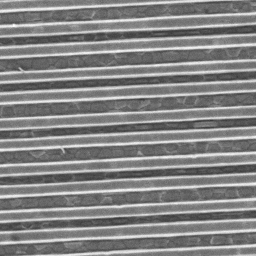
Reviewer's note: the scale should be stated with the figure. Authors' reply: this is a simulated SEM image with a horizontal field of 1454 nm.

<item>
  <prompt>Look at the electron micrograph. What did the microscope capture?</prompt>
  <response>parallel lines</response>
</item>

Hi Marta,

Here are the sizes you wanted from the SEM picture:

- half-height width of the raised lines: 61.7 nm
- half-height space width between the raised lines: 76.6 nanometres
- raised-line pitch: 130 nm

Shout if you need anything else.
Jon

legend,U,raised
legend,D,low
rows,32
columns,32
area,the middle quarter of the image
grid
DDDDDDDDDDDDDDDDDDDDDDUUUUUUUUUU
DDUUUUUUUUUUUUUUUUUUUUUUUUUUUUUU
UUUUUUUUUUUUUUUUUUUUUUUUUUUDDDDD
UUUUUUUUDDDDDDDDDDDDDDDDDDDDDDDD
DDDDDDDDDDDDDDDDDDDDDDDDDDDDDDDD
DDDDDDDDDDDDDDDDDDUUUUUUUUUUUUUU
DDUUUUUUUUUUUUUUUUUUUUUUUUUUUUUU
UUUUUUUUUUUUUUUUUUUUUUUUUUUUUUUU
UUUUUUUUUUUUDDDDDDDDDDDDDDDDDDDD
DDDDDDDDDDDDDDDDDDDDDDDDDDDDDDDD
DDDDDDDDDDDDDDDDDDDDDDDDDDDDDDDD
DDDDDDDDDDDDDDDDDDDDDDDDDDDDDDDD
DDDDDDDDDDDDUUUUUUUUUUUUUUUUUUUU
UUUUUUUUUUUUUUUUUUUUUUUUUUUUUUUU
UUUUUUUUUUUUUUUUUUUUUUDDDDDDDDDD
UUDDDDDDDDDDDDDDDDDDDDDDDDDDDDDD
DDDDDDDDDDDDDDDDDDDDDDDDDDDDDDDD
DDDDDDDDDDDDDUUUUUUUUUUUUUUUUUUU
UUUUUUUUUUUUUUUUUUUUUUUUUUUUUUUU
UUUUUUUUUUUUUUUUUUUUUUUUUUUDDDDD
UUUDDDDDDDDDDDDDDDDDDDDDDDDDDDDD
DDDDDDDDDDDDDDDDDDDDDDDDDDDDDDDD
DDDDDDDDDDDDDDDDDDDDDDDDDDDDDDDD
DDDDDDDDDDDDDDDDDDDDDDUUUUUUUUUU
DDDUUUUUUUUUUUUUUUUUUUUUUUUUUUUU
UUUUUUUUUUUUUUUUUUUUUUUUUUUUUUUU
UUUUUUUUUUUUUUUDDDDDDDDDDDDDDDDD
DDDDDDDDDDDDDDDDDDDDDDDDDDDDDDDD
DDDDDDDDDDDDDDDDDDDDDDDUUUUUUUUU
DDDDDDDUUUUUUUUUUUUUUUUUUUUUUUUU
UUUUUUUUUUUUUUUUUUUUUUUUUUUUUUUU
UUUUUUUUUUUUUUUUUDDDDDDDDDDDDDDD